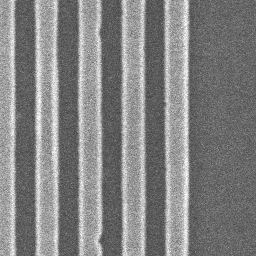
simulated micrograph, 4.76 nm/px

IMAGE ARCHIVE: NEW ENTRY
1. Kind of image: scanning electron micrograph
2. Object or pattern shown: parallel lines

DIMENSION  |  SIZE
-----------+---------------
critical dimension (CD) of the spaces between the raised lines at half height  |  110 nanometres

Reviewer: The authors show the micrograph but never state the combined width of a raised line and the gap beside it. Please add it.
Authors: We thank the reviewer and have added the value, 206 nm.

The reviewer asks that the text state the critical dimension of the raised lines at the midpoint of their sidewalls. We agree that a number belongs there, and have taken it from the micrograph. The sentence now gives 96.4 nanometers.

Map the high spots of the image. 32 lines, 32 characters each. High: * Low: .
**...**...**...***...**.........
**...**...**...***...**.........
**...**...**...***...**.........
**...**...**...***...**.........
**...**...**...***...**.........
**...**...**...***...**.........
**...**...**...***...**.........
**...**...**...***...**.........
**...**...**...***...**.........
**...**...**...***...**.........
**...**...**...***...**.........
**...**...**...***...**.........
**...**...**...***...**.........
**...**...**...***...**.........
**...**...**...***...**.........
**...**...**...***...**.........
**...**...***..***...**.........
**...**...**...***...**.........
**...**...***..***...**.........
**...**...***..***...**.........
**...**...***..***...**.........
**...**...***...**...**.........
**...**...***...**...**.........
**...**...***..***...**.........
**...**...***...**...**.........
**...**...***...**...**.........
**...**...***...**...**.........
**...**...***...**...**.........
**...**...***...**...**.........
**...**...***...**...**.........
**...**...**....**...**.........
**...**...***...**...**.........